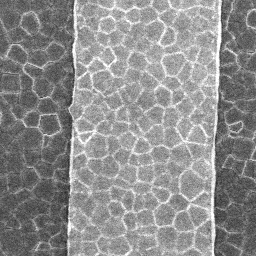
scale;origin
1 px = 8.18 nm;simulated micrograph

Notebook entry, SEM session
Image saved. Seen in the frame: one or a few lines or trenches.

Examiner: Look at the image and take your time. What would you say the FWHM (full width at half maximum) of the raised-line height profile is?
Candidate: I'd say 1.17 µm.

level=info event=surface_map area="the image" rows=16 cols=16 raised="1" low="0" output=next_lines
0000011111111100
0000011111111100
0000011111111100
0000011111111100
0000011111111100
0000011111111100
0000111111111100
0000111111111000
0000011111111000
0000111111111000
0000111111111000
0000111111111000
0000111111111000
0000111111111000
0000111111111000
0000111111111000